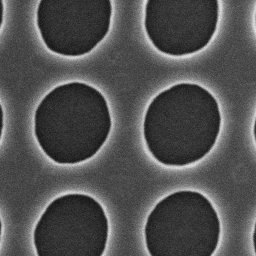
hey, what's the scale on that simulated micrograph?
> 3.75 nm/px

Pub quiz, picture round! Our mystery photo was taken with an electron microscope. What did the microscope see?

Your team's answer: holes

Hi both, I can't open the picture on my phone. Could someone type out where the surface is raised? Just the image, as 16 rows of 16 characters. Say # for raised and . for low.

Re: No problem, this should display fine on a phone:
##.....##.....##
##.....##.....##
###...###....###
################
################
####..#####..###
##.....##.....##
##.....##.....##
##.....##.....##
###...###....###
################
################
###...####...###
###....##.....##
##.....##.....##
##.....##....###